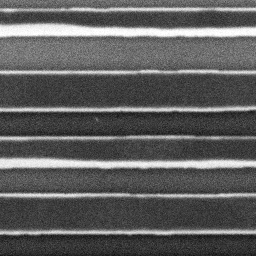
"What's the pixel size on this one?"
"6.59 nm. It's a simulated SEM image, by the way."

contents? lines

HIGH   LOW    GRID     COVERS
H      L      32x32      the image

LLLLLLLLLLLLLLLLLLLLLLLLLLLLLLLL
HHHHHHHHHHHHHHHHHHHHHHHHHHHHHHHH
HHHHHHHHHHHHHHHHHHHHHHHHHHHHHHHH
HHHHHHHHHHHHHHHHHHHHHHHHHHHHHHHH
LLLLLLLLLLLLLLLLLLLLLLLLLLLLLLLL
LLLLLLLLLLLLLLLLLLLLLLLLLLLLLLLL
LLLLLLLLLLLLLLLLLLLLLLLLLLLLLLLL
LLLLLLLLLLLLLLLLLLLLLLLLLLLLLLLL
LLLLLLLLLLLLLLLLLLLLLLLLLLLLLLLL
HHHHHHHHHHHHHHHHHHHHHHHHHHHHHHHH
HHHHHHHHHHHHHHHHHHHHHHHHHHHHHHHH
HHHHHHHHHHHHHHHHHHHHHHHHHHHHHHHH
HHHHHHHHHHHHHHHHHHHHHHHHHHHHHHHH
HHHHHHHHHHHHHHHHHHHHHHHHHHHHHHHH
LLLLLLLLLLLLLLLLLLLLLLLLLLLLLLLL
LLLLLLLLLLLLLLLLLLLLLLLLLLLLLLLL
LLLLLLLLLLLLLLLLLLLLLLLLLLLLLLLL
HHHHHHHHHHHHHHHHHHHHHHHHHHHHHHHH
HHHHHHHHHHHHHHHHHHHHHHHHHHHHHHHH
HHHHHHHHHHHHHHHHHHHHHHHHHHHHHHHH
HHLLLLLHHHHHHHHHHHHHHHHHHHHHHHHH
LLLLLLLLLLLLLLLLLLLLLLLLLLLLLLLL
LLLLLLLLLLLLLLLLLLLLLLLLLLLLLLLL
LLLLLLLLLLLLLLLLLLLLLLLLLLLLLLLL
HHHHHHHHHHHHHHHHHHHHHHHHHHHHHHHH
HHHHHHHHHHHHHHHHHHHHHHHHHHHHHHHH
HHHHHHHHHHHHHHHHHHHHHHHHHHHHHHHH
HHHHHHHHHHHHHHHHHHHHHHHHHHHHHHHH
HHHHHHHHHHHHHHHHHHHHHHHHHHHHHHHH
LLLLLLLLLLLLLLLLLLLLLLLLLLLLLLLL
LLLLLLLLLLLLLLLLLLLLLLLLLLLLLLLL
LLLLLLLLLLLLLLLLLLLLLLLLLLLLLLLL